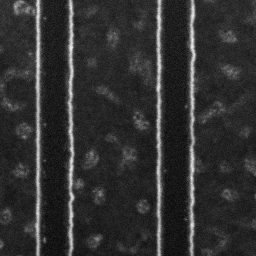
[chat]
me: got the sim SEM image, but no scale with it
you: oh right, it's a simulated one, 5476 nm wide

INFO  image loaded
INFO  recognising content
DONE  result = one or a few lines or trenches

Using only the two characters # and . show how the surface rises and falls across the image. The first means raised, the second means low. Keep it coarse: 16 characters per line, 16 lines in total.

##..######..####
##..######..####
##..######..####
##..######..####
##..######..####
##..######..####
##..######..####
##..######..####
##..######..####
##..######..####
##..######..####
##..######..####
##..######..####
##..######..####
##..######..####
##..######..####